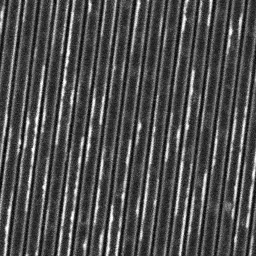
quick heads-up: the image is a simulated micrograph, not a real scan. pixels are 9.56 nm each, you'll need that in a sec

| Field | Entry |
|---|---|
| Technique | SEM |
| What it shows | parallel lines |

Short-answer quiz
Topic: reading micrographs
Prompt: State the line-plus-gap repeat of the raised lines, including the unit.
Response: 151 nm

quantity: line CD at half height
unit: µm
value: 0.113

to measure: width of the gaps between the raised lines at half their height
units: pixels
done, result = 4.59